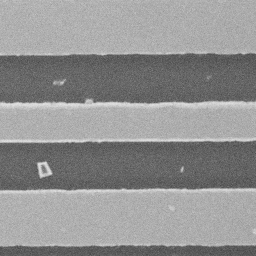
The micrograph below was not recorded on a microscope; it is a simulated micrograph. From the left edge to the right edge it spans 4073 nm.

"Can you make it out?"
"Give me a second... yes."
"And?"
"lines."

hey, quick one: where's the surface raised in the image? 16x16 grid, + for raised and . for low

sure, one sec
++++++++++++++++
++++++++++++++++
++++++++++++++++
................
................
................
+++++++++.++++++
++++++++++++++++
++++++++++++++++
................
................
................
++++++++++++++++
++++++++++++++++
++++++++++++++++
................